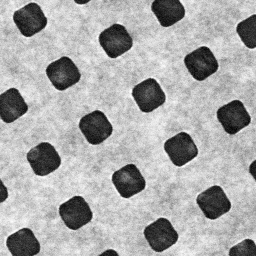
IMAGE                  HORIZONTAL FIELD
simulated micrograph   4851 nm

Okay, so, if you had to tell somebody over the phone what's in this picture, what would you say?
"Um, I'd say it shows a regular array of holes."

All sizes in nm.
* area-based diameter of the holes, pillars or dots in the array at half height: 626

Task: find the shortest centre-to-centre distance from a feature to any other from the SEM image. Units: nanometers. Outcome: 1170